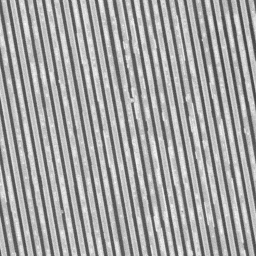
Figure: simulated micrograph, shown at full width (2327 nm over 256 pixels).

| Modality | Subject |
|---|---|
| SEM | parallel lines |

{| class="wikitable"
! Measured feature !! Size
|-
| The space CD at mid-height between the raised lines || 40.3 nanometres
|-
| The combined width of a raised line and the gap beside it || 79.2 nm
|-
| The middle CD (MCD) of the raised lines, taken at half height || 41.4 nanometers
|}